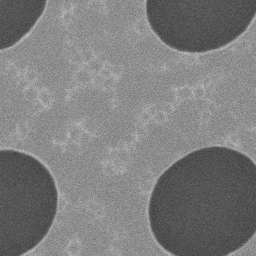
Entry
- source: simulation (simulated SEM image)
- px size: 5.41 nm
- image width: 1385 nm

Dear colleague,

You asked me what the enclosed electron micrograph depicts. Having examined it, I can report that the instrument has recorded holes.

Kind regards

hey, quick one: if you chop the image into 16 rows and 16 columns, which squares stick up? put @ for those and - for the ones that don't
---@@@@@@-------
--@@@@@@@-------
-@@@@@@@@@-----@
@@@@@@@@@@@@@@@@
@@@@@@@@@@@@@@@@
@@@@@@@@@@@@@@@@
@@@@@@@@@@@@@@@@
@@@@@@@@@@@@@@@@
@@@@@@@@@@@@@@@@
-@@@@@@@@@@@---@
---@@@@@@@@-----
---@@@@@@@------
----@@@@@-------
---@@@@@@-------
---@@@@@@@------
--@@@@@@@@-----@